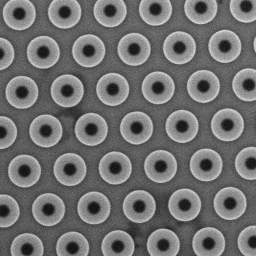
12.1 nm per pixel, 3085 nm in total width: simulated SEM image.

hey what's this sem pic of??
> an array of small figures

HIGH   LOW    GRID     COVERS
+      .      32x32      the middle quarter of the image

.....++.........................
................................
...........++.........+++.......
+++......++++++.....+++++++....+
++++.....+++++++....+++++++....+
+++++...++++++++....+++++++....+
+++++...++++++++....+++++++....+
+++++...++++++++....+++++++....+
++++.....+++++++....+++++++.....
++++......+++++.......+++.......
++..............................
................................
......++........++++.......+++++
....++++++.....++++++.....++++++
...+++++++....++++++++....++++++
...++++++++...++++++++....++++++
...++++++++...++++++++....++++++
...++++++++...++++++++....++++++
...+++++++.....++++++......+++++
....+++++.......++++.........++.
................................
................................
.++........++++.......+++++.....
++++......++++++.....+++++++....
+++++....++++++++...++++++++....
+++++....++++++++...++++++++....
+++++....++++++++...++++++++....
+++++....+++++++.....+++++++....
+++++.....++++++.....++++++.....
++++.......++++........++.......
................................
.............................+++